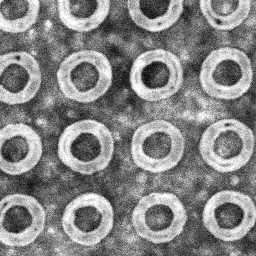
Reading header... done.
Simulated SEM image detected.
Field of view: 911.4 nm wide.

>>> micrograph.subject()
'a regular array of ring-shaped raised bodies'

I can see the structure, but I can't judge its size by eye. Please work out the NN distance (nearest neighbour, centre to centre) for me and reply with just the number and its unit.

0.25 um